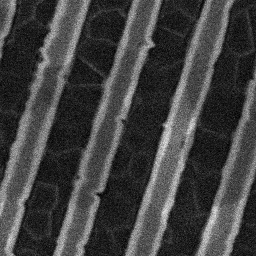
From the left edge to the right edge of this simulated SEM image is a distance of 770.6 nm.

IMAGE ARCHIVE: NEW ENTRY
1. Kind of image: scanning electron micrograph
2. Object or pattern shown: one or a few lines or trenches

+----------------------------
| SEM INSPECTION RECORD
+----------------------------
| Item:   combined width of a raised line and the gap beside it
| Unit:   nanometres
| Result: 209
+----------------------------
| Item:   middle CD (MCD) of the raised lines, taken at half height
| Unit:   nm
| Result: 75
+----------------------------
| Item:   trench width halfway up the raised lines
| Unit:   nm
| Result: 134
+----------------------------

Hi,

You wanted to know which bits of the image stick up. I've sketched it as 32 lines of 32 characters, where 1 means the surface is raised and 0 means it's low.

11000000111000000111000000111000
11000001111000001111000001110000
10000001110000001110000001110000
10000001110000001110000001110000
10000011110000001110000011110000
00000011100000011110000011100000
00000111100000011100000011100000
00000111100000011100000011100000
00000111000000111000000111000000
00000111000000111000000111000000
00001111000001111000000111000000
00001110000001110000001111000001
00001110000001110000001110000001
00011110000001110000001110000001
00011100000011100000011110000001
00011100000011100000011100000011
00111100000011100000011100000011
00111100000111100000111100000111
00111000000111000000111100000111
00111000000111000000111000000111
01111000001111000001111000001111
01110000001110000001110000001111
01110000001110000001110000001110
11110000001110000001110000001110
11100000011100000011110000011110
11100000011100000011100000011100
11100000011100000011100000011100
11000000111000000111100000111100
11000000111000000111000000111100
11000000111000000111000000111000
10000001110000001111000001111000
10000001110000001110000001111000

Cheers